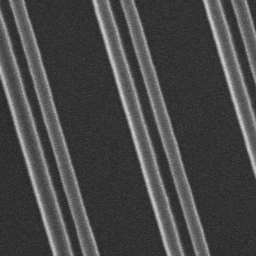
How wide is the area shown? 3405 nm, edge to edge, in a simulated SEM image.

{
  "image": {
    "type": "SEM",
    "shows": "lines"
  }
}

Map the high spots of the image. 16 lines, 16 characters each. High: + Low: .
++....++.....++.
++....+++....+++
++.....++.....++
++.....++.....++
+++....+++....++
+++.....++....++
.++.....++.....+
.+++....+++....+
.+++....+++....+
..++.....++.....
..++.....++.....
..+++....+++....
..+++.....++....
...++.....++....
...+++....+++...
...+++....+++...